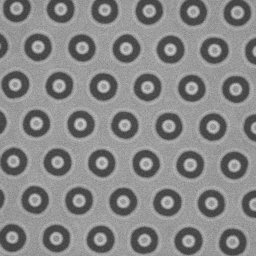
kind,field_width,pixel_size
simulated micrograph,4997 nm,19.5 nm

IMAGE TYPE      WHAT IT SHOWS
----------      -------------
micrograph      an array of small figures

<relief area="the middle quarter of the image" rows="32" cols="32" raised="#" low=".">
################################
################################
..######....#######....########.
..#####......#####......#####...
...###.......#####.......###....
...###...##...###...##...###...#
...###...##...###...##...###...#
..####.......####.......####....
.######.....######......#####...
#########.##########..########..
################################
###...##########################
#......######.....######.....###
#.......####.......####......###
...##...####..##...####...#...##
...##...###...##...###...##...##
#.......####.......####..##...##
#......#####......#####.......##
##...########....#######.....###
################################
################################
.#######....#######...########..
..#####......####......######...
..####.......####.......####....
..####..###..####..###..####..##
..####..###..####..###..####..##
..####.......####.......####....
.######.....######.....#####....
#########.#########...########..
################################
###.############################
#......#####.....#######....####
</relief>